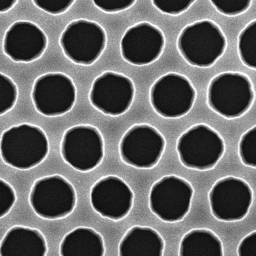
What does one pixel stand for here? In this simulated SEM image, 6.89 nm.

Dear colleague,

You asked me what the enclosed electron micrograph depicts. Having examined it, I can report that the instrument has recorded a regular array of holes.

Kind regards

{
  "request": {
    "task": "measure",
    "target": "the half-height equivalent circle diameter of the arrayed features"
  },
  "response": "290 nm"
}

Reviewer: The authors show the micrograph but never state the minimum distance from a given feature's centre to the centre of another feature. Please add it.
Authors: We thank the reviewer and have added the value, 0.4 um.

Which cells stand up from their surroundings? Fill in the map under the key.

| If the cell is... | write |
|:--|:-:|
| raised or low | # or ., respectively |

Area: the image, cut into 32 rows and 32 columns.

..###....###....###.....###....#
######..#############.######..##
################################
#....###.....####..####....####.
#.....##.....###....###.....##..
#.....##.....##.....##......##..
#....###.....##.....###.....##..
##..#####...####...####....###..
################################
.#####..#####..######.#####...##
..###....###....###.....##.....#
..##.....##......##.....##.....#
..##.....##.....###.....##.....#
.####....###....###.....###....#
#####################.######.###
################################
#....####...####....####...####.
......##.....##.....##......##..
......##.....##.....##......##..
......##.....##.....###....###..
#....####...####...####....####.
################################
#####...#####..#####...#####..##
.###.....###....###.....###....#
..##.....##.....###.....##.....#
..##.....###....###.....##.....#
.####....###....###....####....#
#####################.######.###
##.##############.##############
#....###....####....###....####.
......##.....##.....###.....##..
......##.....##.....##......##..